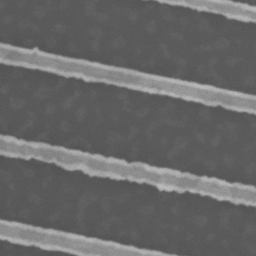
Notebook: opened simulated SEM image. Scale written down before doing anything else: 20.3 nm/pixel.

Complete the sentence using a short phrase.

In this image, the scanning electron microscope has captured one or a few lines or trenches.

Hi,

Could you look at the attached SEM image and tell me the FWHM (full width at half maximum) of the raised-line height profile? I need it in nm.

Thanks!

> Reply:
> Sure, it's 291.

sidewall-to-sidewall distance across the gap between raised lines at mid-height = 1520 nanometers